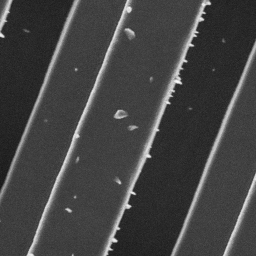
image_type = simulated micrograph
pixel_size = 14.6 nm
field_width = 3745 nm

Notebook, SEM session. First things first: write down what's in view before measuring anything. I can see lines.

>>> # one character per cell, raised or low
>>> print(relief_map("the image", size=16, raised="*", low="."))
*....********...
....********....
....********....
...*********....
...********....*
...********....*
..********.....*
..********....**
..********....**
.********....***
.********....***
********.....***
********....****
********....****
*******....*****
*******....*****